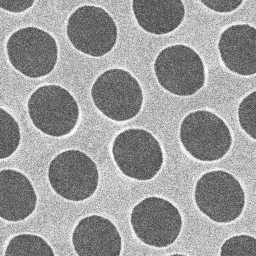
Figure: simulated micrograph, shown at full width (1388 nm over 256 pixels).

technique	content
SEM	a regular array of holes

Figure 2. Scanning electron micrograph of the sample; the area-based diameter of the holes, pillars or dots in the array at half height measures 51.6 px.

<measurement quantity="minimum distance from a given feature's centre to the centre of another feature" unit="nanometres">340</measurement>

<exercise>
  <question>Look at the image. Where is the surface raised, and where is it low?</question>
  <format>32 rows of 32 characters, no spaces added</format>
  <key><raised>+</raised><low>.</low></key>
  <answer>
....+++++++++++++......++.....++
+..++++++....++++......++++..+++
++++++++......+++......+++++++++
+++..+++.......+++....++++++....
+......+.......+++++++++++++....
+......++.....+++++++++++++.....
+......+++....++++++.....++.....
+......++++++++++++......+++....
++.....++++++++++++.......++....
+++...++++++.....+++......++++++
++++++++++++.....+++......++++++
++++.....++.......+++....+++++++
++++.....+++......++++++++++++..
+++.......++......++++++++++++..
..++......+++....++++++....+++..
..++......+++++++++++++.....++..
...++....++++++....+++.......++.
...+++++++++++......+++......+++
..++++++++++++......+++......+++
.++++++....+++......++++....++++
++++++......++......++++++++++++
...+++......+++.....++++++..++++
....++......+++++..++++++.....++
....+++.....++++++++++++......++
.....+++...+++++++++++++.......+
.....++++++++++++.....++.......+
....++++++++++++.......++.....++
+..+++++++....++.......+++...+++
+++++++++......++......+++++++++
++...++++......++.....+++++++..+
+.....+++......+++...+++++++....
+......++......+++++++++++++....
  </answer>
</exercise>